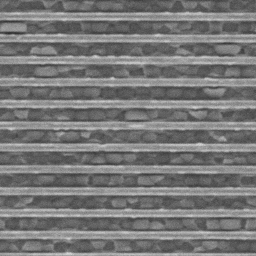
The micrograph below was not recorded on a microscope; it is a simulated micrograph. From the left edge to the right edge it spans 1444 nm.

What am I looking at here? parallel lines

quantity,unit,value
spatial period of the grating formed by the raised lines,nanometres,123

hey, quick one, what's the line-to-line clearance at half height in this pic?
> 81.7 nm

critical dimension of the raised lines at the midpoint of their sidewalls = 40.9 nanometers